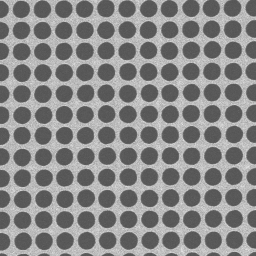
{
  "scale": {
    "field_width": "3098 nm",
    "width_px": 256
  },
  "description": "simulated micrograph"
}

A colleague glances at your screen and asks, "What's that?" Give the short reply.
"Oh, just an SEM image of a regular array of holes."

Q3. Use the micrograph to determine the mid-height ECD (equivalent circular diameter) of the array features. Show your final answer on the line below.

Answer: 212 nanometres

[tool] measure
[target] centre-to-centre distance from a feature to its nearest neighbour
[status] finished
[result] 251 nm